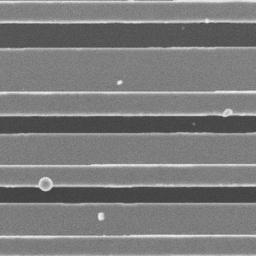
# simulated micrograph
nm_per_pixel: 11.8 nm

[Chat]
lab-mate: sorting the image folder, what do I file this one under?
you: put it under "lines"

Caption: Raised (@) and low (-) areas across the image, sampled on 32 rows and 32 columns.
@@@@@@@@@@@@@@@@@@@@@@@@@@@@@@@@
@@@@@@@@@@@@@@@@@@@@@@@@@@@@@@@@
@@@@@@@@@@@@@@@@@@@@@@@@@@@@@@@@
--------------------------------
--------------------------------
--------------------------------
@@@@@@@@@@@@@@@@@@@@@@@@@@@@@@@@
@@@@@@@@@@@@@@@@@@@@@@@@@@@@@@@@
@@@@@@@@@@@@@@@@@@@@@@@@@@@@@@@@
@@@@@@@@@@@@@@@@@@@@@@@@@@@@@@@@
@@@@@@@@@@@@@@@@@@@@@@@@@@@@@@@@
@@@@@@@@@@@@@@@@@@@@@@@@@@@@@@@@
@@@@@@@@@@@@@@@@@@@@@@@@@@@@@@@@
@@@@@@@@@@@@@@@@@@@@@@@@@@@@@@@@
----------------------------@---
--------------------------------
--------------------------------
@@@@@@@@@@@@@@@@@@@@@@@@@@@@@@@@
@@@@@@@@@@@@@@@@@@@@@@@@@@@@@@@@
@@@@@@@@@@@@@@@@@@@@@@@@@@@@@@@@
@@@@@@@@@@@@@@@@@@@@@@@@@@@@@@@@
@@@@@@@@@@@@@@@@@@@@@@@@@@@@@@@@
@@@@@@@@@@@@@@@@@@@@@@@@@@@@@@@@
-----@--------------------------
--------------------------------
@@@@@@@@--@@@@@@@@@@@@@@@@@@@@@@
@@@@@@@@@@@@@@@@@@@@@@@@@@@@@@@@
@@@@@@@@@@@@@@@@@@@@@@@@@@@@@@@@
@@@@@@@@@@@@@@@@@@@@@@@@@@@@@@@@
@@@@@@@@@@@@@@@@@@@@@@@@@@@@@@@@
@@@@@@@@@@@@@@@@@@@@@@@@@@@@@@@@
@@@@@@@@@@@@@@@@@@@@@@@@@@@@@@@@